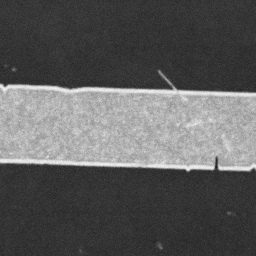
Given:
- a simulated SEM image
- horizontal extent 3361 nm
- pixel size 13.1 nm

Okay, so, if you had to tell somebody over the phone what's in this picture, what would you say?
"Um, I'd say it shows one or a few lines or trenches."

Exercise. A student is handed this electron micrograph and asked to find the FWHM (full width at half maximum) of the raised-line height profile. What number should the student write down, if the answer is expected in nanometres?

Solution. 973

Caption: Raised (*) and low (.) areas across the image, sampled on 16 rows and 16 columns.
................
................
................
................
................
***.............
****************
****************
****************
****************
..............*.
................
................
................
................
................